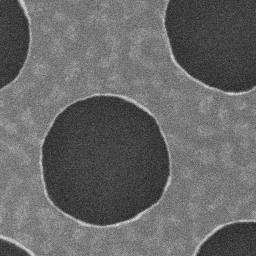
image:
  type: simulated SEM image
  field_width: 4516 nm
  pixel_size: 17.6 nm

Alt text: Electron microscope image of holes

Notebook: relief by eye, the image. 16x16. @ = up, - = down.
-@@@@@@@@@------
--@@@@@@@@------
--@@@@@@@@@-----
--@@@@@@@@@-----
-@@@@@@@@@@@----
@@@@@@@@@@@@@---
@@@@@----@@@@@@@
@@@-------@@@@@@
@@@-------@@@@@@
@@@--------@@@@@
@@@--------@@@@@
@@@-------@@@@@@
@@@-------@@@@@@
@@@@----@@@@@@@@
@@@@@@@@@@@@@---
-@@@@@@@@@@@----